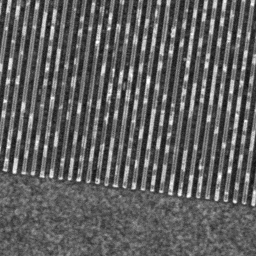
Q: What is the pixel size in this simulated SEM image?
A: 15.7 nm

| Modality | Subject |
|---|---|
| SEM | parallel lines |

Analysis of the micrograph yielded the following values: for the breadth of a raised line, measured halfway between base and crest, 42.9 nm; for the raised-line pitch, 0.146 µm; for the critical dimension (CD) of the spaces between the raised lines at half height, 0.0974 microns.